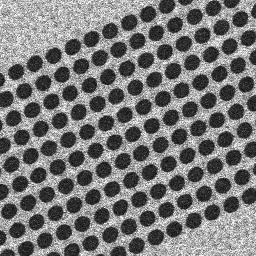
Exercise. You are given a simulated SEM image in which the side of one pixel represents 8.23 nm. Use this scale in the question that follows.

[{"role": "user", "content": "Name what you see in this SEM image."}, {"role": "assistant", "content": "a regular array of holes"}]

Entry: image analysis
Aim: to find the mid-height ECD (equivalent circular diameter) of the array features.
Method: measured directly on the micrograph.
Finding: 132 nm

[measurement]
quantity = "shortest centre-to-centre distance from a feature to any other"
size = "168 nanometres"